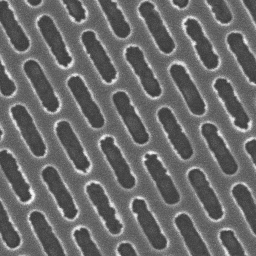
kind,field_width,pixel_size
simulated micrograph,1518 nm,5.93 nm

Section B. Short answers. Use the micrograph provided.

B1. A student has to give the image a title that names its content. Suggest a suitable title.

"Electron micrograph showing a regular array of holes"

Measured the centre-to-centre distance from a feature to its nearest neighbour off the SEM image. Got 275 nm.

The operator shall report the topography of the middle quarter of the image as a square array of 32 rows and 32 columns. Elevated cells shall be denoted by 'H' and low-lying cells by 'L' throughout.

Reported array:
LHHHHHHHLLLLHHHHHLLLLHHHHHHLLHHH
HHHHHHHHLLLLLHHHHLLLLLHHHHLLLLHH
HHHHHHHHHLLLLHHHHHLLLLHHHHHLLLLH
HHLLHHHHHLLLLHHHHHHLLLLHHHHLLLLL
HLLLLHHHHHHLHHHHHHHLLLLLHHHHLLLL
HLLLLHHHHHHHHHHHHHHHLLLLHHHHLLLL
HHLLLLHHHHHHHHHHHHHHLLLLHHHHHLLL
HHLLLLLHHHHHHLLLHHHHHLLLHHHHHHLL
HHHLLLLHHHHHLLLLHHHHHHHHHHHHHHLL
HHHLLLLLHHHHLLLLLHHHHHHHHHHHHHLL
HHHHLLLLLHHHHLLLLHHHHHHHHHHHHHHL
HHHHLLLLLHHHHLLLLLHHHHHHLLLHHHHL
HHHHHLLLLHHHHHLLLLHHHHHLLLLHHHHH
HHHHHHLLLLHHHHLLLLLHHHHHLLLLHHHH
LHHHHHLLLLHHHHHLLLLLHHHHLLLLHHHH
LLHHHHHLLLHHHHHLLLLLHHHHHLLLLHHH
LLHHHHHHHHHHHHHHLLLLHHHHHLLLLHHH
LLLHHHHHHHHHHHHHHLLLLHHHHHLLLLHH
LLLHHHHHHHLLHHHHHLLLLHHHHHLLLLLH
LLLLHHHHHLLLHHHHHHLLLHHHHHHLLLLH
LLLLLHHHHLLLLHHHHHHHHHHHHHHLLLLL
LLLLLHHHHLLLLLHHHHHHHHHHHHHHLLLL
HLLLLHHHHHLLLLHHHHHHHHLHHHHHHLLL
HLLLLLHHHHHLLLLHHHHHLLLHHHHHHLLL
HHLLLLHHHHHLLLLLHHHHLLLLHHHHHHHH
HHHLLLHHHHHHLLLLHHHHLLLLLHHHHHHH
HHHHLLHHHHHHLLLLLHHHHLLLLLHHHHHH
HHHHHHHHHHHHHLLLLHHHHLLLLLHHHHHL
HHHHHHHHHHHHHLLLLLHHHHLLLLLHHHHL
HHHHHHHHHHHHHHLLLLHHHHHLLLLHHHHL
HHHHHHLLLHHHHHLLLLHHHHHLLLLLHHHH
LHHHHHLLLLHHHHHHHHHHHHHLLLLLHHHH